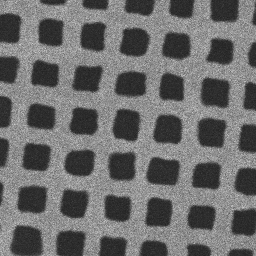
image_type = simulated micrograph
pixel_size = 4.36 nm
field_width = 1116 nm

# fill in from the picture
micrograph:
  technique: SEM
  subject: a regular array of holes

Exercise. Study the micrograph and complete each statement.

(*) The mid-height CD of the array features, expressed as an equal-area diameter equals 125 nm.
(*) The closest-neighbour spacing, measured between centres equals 181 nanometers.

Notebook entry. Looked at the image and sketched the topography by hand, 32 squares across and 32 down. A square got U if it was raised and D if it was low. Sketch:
UUUUUUDDUUDDDUUUDDDUUDDDUUDDDDUU
UUUUUUUUUUUUUUUUDDDUUDDDUUDDDDUU
DDDUUDDUUUUUUUUUUUUUUUUUUUUDDUUU
DDDUUDDDUUDDDUUUUUUUUUUUUUUUUUUU
DDUUUDDDUUDDDUUDDDDUUDDUUUUUUUUU
UUUUUUDDUUDDDUUDDDDUDDDDUUDDDUUU
UUUUUUUUUUUUUUUDDDUUDDDDUUDDDUUD
DDUUUUUUUUUUUUUUUUUUUUUUUUDDDUUD
DDUUDDDUUUDDDUUUUUUUUUUUUUUUUUUU
DDUUDDDUUDDDDUUDDDUUDDUUUUUUUUUU
UUUUDDDUUDDDUUUDDDUUDDDUUDDDDUUD
UUUUUUUUUUUUUUUDDDUUDDDUUDDDDUUD
DUUUUUUUUUUUUUUUUUUUUUDUUDDDDUUD
DUUUDDUUUUUUUUUUUUUUUUUUUUUUUUUD
DUUDDDDUUDDDUUDDDUUUDDUUUUUUUUUU
DUUUDDDUUDDDUUDDDUUUDDDUUDDDUUUU
UUUUUUUUUDDDUUDDDUUDDDDUUDDDUUDD
DUUUUUUUUUUUUUUUDUUDDDDUUDDDUUDD
DUUDDDUUUUUUUUUUUUUUUUUUUUUUUUDD
DUUDDDUUDDDDUUDDDUUUUUUUUUUUUUUU
UUUDDDUUDDDDUUDDDUUDDDUUUDDUUUUU
UUUUUUUUDDDUUUDDDUDDDDUUDDDDUUDD
UUUUUUUUUUUUUUUUUUUDDDUUDDDUUDDD
UUUDDUUUUUUUUUUUUUUUUUUUUDDUUUDD
UUDDDDUUDDDUUDUUUUUUUUUUUUUUUUUU
UUDDDDUUDDDUUDDDUUDDDUUUUUUUUUUU
UUUUDUUUDDDUUDDDUUDDDUUUDDDUUDDD
UUUUUUUUUUUUUUDDUUDDDUUDDDDUUDDD
UUDDUUUUUUUUUUUUUUUUUUUUDDUUUDDD
UUDDDUUDDDUUUUUUUUUUUUUUUUUUUUUU
UDDDDUUDDDUUUDDDUUDDDUUUUUUUUUUU
UUDDDUUDDDUUDDDDUUDDDUUDDDUUUDDU